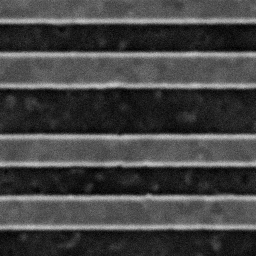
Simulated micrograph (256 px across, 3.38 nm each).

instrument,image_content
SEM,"one or a few lines or trenches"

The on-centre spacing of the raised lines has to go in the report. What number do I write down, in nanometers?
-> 240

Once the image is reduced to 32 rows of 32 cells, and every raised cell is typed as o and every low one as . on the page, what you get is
oooooooooooooooooooooooooooooooo
oooooooooooooooooooooooooooooooo
oooooooooooooooooooooooooooooooo
................................
................................
................................
................................
oooooooooooooooooooooooooooooooo
oooooooooooooooooooooooooooooooo
oooooooooooooooooooooooooooooooo
oooooooooooooooooooooooooooooooo
................................
................................
................................
................................
................................
................................
oooooooooooooooooooooooooooooooo
oooooooooooooooooooooooooooooooo
oooooooooooooooooooooooooooooooo
oooooooooooooooooooooooooooooooo
................................
................................
................................
................................
oooooooooooooooooooooooooooooooo
oooooooooooooooooooooooooooooooo
oooooooooooooooooooooooooooooooo
................................
................................
................................
................................